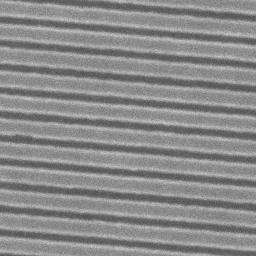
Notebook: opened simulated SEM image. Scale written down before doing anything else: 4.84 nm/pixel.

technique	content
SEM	parallel lines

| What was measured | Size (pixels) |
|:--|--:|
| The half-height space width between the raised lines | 8.84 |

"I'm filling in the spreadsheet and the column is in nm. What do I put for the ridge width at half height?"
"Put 73.5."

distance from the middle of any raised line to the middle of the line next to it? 114 nm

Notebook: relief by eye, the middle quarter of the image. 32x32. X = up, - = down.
XXXXXXXXXXXXXXXXXXXXXXXXXXXXXXXX
-----X-XXXXXXXXXXXXXXXXXXXXXXXXX
-------------------XXXXXXXXXXXXX
XXX--------------------------XXX
XXXXXXXXXXXXXX------------------
XXXXXXXXXXXXXXXXXXXXXXXXX-------
XXXXXXXXXXXXXXXXXXXXXXXXXXXXXXXX
------XXXXXXXXXXXXXXXXXXXXXXXXXX
------------------XXXXXXXXXXXXXX
XXXX-------------------------XXX
XXXXXXXXXXXXXXX-----------------
XXXXXXXXXXXXXXXXXXXXXXXXXXX-----
XXXXXXXXXXXXXXXXXXXXXXXXXXXXXXXX
------XXX-XXXXXXXXXXXXXXXXXXXXXX
--------------------XXXXXXXXXXXX
XXXXX--------------------------X
XXXXXXXXXXXXXXX-----------------
XXXXXXXXXXXXXXXXXXXXXXXXXXX-----
XXXXXXXXXXXXXXXXXXXXXXXXXXXXXXXX
--------XXXXXXXXXXXXXXXXXXXXXXXX
---------------------XXXXXXXXXXX
XXXXX---------------------------
XXXXXXXXXXXXXXXXX---------------
XXXXXXXXXXXXXXXXXXXXXXXXXXXX----
XXXXXXXXXXXXXXXXXXXXXXXXXXXXXXXX
---------XXXXXXXXXXXXXXXXXXXXXXX
---------------------X-XXXXXXXXX
XXXXXXX-------------------------
XXXXXXXXXXXXXXXXXX--------------
XXXXXXXXXXXXXXXXXXXXXXXXXXX-XX--
XXXXXXXXXXXXXXXXXXXXXXXXXXXXXXXX
-----------XXXXXXXXXXXXXXXXXXXXX